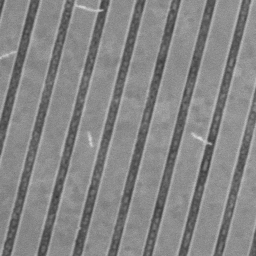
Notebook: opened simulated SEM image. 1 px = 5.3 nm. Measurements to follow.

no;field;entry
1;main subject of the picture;parallel lines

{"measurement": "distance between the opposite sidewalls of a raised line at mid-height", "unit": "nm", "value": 126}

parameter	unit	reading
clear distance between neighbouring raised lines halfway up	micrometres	0.0552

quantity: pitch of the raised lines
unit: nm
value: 181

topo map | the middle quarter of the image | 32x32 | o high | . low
ooooo...oooooo..ooooooo..oooooo.
ooooo..ooooooo..oooooo...oooooo.
ooooo..oooooo...oooooo...oooooo.
oooo...oooooo...oooooo...oooooo.
oooo...oooooo..ooooooo..oooooo..
oooo..ooooooo..oooooo...oooooo..
oooo..oooooo...oooooo...oooooo..
ooo...oooooo...oooooo...oooooo..
ooo...oooooo..ooooooo..oooooo...
ooo..ooooooo..oooooo...oooooo...
oo...oooooo...oooooo...oooooo...
oo...oooooo...oooooo..ooooooo..o
oo...oooooo..ooooooo..oooooo...o
oo..ooooooo..oooooo...oooooo...o
o...oooooo...oooooo...oooooo...o
o...oooooo...oooooo..ooooooo..oo
o...oooooo..ooooooo..oooooo...oo
o..ooooooo..oooooo...oooooo...oo
...oooooo...oooooo...oooooo...oo
...oooooo...oooooo..ooooooo..ooo
...oooooo..ooooooo..oooooo...ooo
..ooooooo..oooooo...oooooo...ooo
..oooooo...oooooo...oooooo...ooo
..oooooo...oooooo..ooooooo..oooo
..oooooo..ooooooo..oooooo...oooo
.oooooo...oooooo...oooooo...oooo
.oooooo...oooooo...oooooo...oooo
.oooooo...oooooo..ooooooo..ooooo
ooooooo..ooooooo..oooooo...ooooo
ooooooo..oooooo...oooooo...ooooo
oooooo...oooooo...oooooo...ooooo
oooooo...oooooo..ooooooo..oooooo